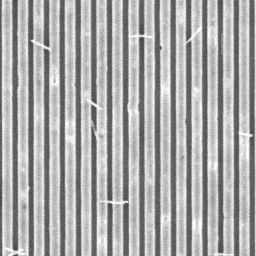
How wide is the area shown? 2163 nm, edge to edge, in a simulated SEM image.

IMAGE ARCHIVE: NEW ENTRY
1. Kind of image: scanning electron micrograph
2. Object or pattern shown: parallel lines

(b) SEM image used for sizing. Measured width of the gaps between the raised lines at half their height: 0.0486 micrometres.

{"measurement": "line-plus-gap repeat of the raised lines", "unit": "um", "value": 0.134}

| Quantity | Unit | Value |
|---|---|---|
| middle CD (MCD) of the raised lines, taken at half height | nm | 81.3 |